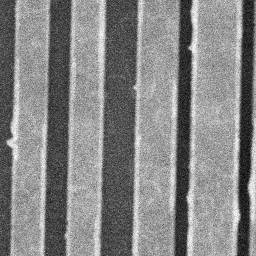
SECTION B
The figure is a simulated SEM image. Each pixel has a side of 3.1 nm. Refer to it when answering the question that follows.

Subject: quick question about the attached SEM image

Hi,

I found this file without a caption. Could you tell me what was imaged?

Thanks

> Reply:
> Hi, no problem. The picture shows one or a few lines or trenches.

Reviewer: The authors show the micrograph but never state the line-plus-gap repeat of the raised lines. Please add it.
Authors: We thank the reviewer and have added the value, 191 nm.